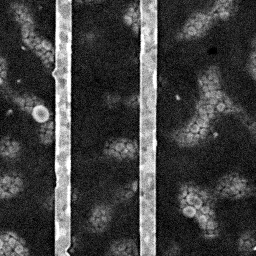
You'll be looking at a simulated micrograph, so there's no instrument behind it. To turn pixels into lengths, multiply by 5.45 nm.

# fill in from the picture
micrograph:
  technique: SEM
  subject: one or a few lines or trenches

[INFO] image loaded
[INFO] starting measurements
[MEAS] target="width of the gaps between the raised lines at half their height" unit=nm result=382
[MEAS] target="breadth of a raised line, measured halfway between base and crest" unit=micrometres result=0.0832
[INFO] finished